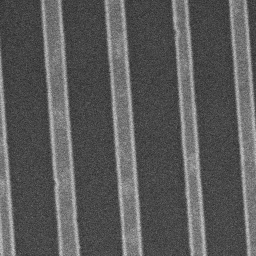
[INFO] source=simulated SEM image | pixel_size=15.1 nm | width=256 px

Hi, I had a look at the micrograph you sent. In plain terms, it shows one or a few lines or trenches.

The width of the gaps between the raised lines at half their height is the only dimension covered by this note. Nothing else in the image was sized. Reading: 0.721 microns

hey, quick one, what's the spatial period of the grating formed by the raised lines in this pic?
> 63 px